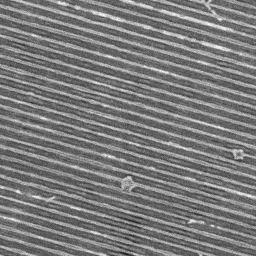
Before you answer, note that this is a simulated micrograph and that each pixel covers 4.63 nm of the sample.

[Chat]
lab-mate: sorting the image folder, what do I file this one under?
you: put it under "parallel lines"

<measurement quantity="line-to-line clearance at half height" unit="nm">34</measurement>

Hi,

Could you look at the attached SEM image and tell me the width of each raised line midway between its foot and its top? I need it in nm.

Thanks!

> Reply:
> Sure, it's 8.9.